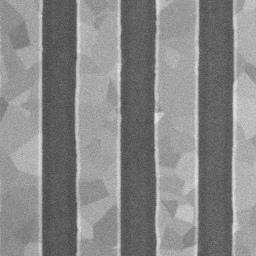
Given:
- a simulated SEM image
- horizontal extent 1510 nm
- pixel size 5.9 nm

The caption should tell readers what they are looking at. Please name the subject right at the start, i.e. lines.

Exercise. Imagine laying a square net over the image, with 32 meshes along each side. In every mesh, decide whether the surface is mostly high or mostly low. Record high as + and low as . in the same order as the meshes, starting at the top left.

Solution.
+++++.....+++++....++++++....+++
+++++.....+++++.....+++++....+++
+++++.....+++++.....+++++....+++
+++++.....+++++.....+++++....+++
+++++.....+++++....++++++....+++
+++++.....+++++....++++++....+++
+++++.....+++++....++++++....+++
+++++.....+++++....++++++....+++
+++++.....+++++....++++++....+++
+++++.....+++++....++++++....+++
+++++.....+++++....++++++....+++
+++++.....+++++....++++++....+++
+++++....++++++....++++++....+++
+++++....++++++....++++++....+++
+++++.....+++++....++++++....+++
+++++.....+++++....++++++....+++
+++++....++++++....++++++....+++
+++++....++++++....++++++....+++
+++++.....+++++....++++++....+++
+++++.....+++++....++++++....+++
+++++.....+++++....++++++....+++
+++++.....+++++....++++++....+++
+++++.....+++++.....+++++....+++
+++++.....+++++.....+++++....+++
+++++.....+++++.....+++++....+++
+++++.....+++++.....+++++....+++
+++++.....+++++....++++++....+++
+++++.....+++++....++++++....+++
+++++.....+++++....++++++....+++
+++++.....+++++.....+++++....+++
+++++.....+++++.....+++++....+++
+++++.....+++++.....+++++....+++